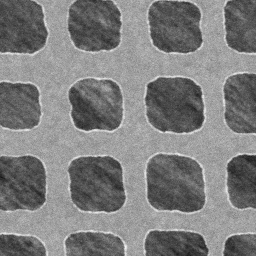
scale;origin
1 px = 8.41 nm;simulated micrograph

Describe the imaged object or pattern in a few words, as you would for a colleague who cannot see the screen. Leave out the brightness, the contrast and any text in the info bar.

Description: holes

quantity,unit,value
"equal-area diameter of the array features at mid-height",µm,0.513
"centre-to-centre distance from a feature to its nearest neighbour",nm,659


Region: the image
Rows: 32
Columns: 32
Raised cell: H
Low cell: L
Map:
LLLLLHHHHLLLLLHHHHHLLLLLHHHHLLLL
LLLLLHHHHLLLLLLHHHHLLLLLLHHHLLLL
LLLLLLHHLLLLLLLHHHLLLLLLLHHHLLLL
LLLLLLHHLLLLLLLHHHHLLLLLLHHHLLLL
LLLLLLHHHLLLLLLHHHHLLLLLLHHHLLLL
LLLLLLHHHLLLLLLHHHHLLLLLLHHHLLLL
LLLLLHHHHHHHHHHHHHHHLLLLHHHHHHLL
HHHHHHHHHHHHHHHHHHHHHHHHHHHHHHHH
HHHHHHHHHHHHHHHHHHHHHHHHHHHHHHHH
HHHHHHHHHHHHHHHHHHHHHHHHHHHHHLLL
LLLLHHHHHLLLLLLHHHLLLLLLLHHHLLLL
LLLLLHHHHLLLLLLHHHLLLLLLLHHHLLLL
LLLLLHHHHLLLLLLHHHLLLLLLLHHHLLLL
LLLLLHHHHLLLLLLHHHLLLLLLLLHHLLLL
HLLLLHHHHLLLLLLHHHLLLLLLLLHHLLLL
LLLLLHHHHLLLLLLHHHHLLLLLLHHHLLLL
HHHHHHHHHHHHHHHHHHHHLLLLHHHHHLLL
HHHHHHHHHHHHHHHHHHHHHHHHHHHHHHHH
HHHHHHHHHHHHHHHHHHHHHHHHHHHHHHHH
LHHLHHHHHHLLLHHHHHHLLLLHHHHHHLLL
LLLLLHHHHLLLLLLHHHLLLLLLLHHHLLLL
LLLLLLHHLLLLLLLHHHLLLLLLLHHHLLLL
LLLLLLHHHLLLLLLHHHLLLLLLLLHHLHLL
LLLLLLHHHLLLLLLLHHLLLLLLLLHHLLLL
LLLLLLHHHLLLLLLLHHLLLLLLLLHHHLLL
LLLLLLHHHLLLLLLLHHHLLLLLLLHHHLLL
HHHHHHHHHHHLLLHHHHHHHHHLHHHHHHHH
HHHHHHHHHHHHHHHHHHHHHHHHHHHHHHHH
HHHHHHHHHHHHHHHHHHHHHHHHHHHHHHHH
LLLLHHHHHLLLLLLHHHLLLLLLLHHHHLLL
LLLLLHHHLLLLLLLLHHLLLLLLLLHHLLLL
LLLLLLHHLLLLLLLLHHLLLLLLLLHHLLLL